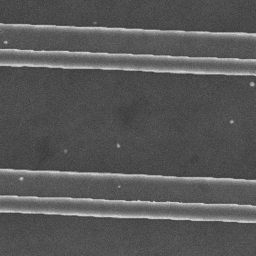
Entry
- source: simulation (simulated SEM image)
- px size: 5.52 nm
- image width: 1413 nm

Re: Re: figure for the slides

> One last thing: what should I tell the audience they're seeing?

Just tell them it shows lines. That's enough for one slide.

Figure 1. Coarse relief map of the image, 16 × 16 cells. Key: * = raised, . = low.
................
................
****************
****************
............****
................
................
................
................
................
................
****************
****************
......**********
................
................